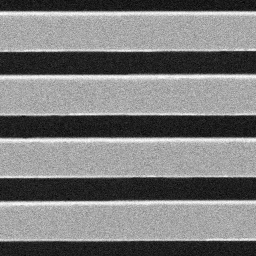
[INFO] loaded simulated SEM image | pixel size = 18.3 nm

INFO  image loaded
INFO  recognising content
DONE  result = lines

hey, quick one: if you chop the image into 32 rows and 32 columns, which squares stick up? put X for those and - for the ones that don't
--------------------------------
XXXXXXXXXXXXXXXXXXXXXXXXXXXXXXXX
XXXXXXXXXXXXXXXXXXXXXXXXXXXXXXXX
XXXXXXXXXXXXXXXXXXXXXXXXXXXXXXXX
XXXXXXXXXXXXXXXXXXXXXXXXXXXXXXXX
XXXXXXXXXXXXXXXXXXXXXXXXXXXXXXXX
--------------------------------
--------------------------------
--------------------------------
XXXXXXXXXXXXXXXXXXXXXXXXXXXXXXXX
XXXXXXXXXXXXXXXXXXXXXXXXXXXXXXXX
XXXXXXXXXXXXXXXXXXXXXXXXXXXXXXXX
XXXXXXXXXXXXXXXXXXXXXXXXXXXXXXXX
XXXXXXXXXXXXXXXXXXXXXXXXXXXXXXXX
--------------------------------
--------------------------------
--------------------------------
XXXXXXXXXXXXXXXXXXXXXXXXXXXXXXXX
XXXXXXXXXXXXXXXXXXXXXXXXXXXXXXXX
XXXXXXXXXXXXXXXXXXXXXXXXXXXXXXXX
XXXXXXXXXXXXXXXXXXXXXXXXXXXXXXXX
XXXXXXXXXXXXXXXXXXXXXXXXXXXXXXXX
--------------------------------
--------------------------------
--------------------------------
XXXXXXXXXXXXXXXXXXXXXXXXXXXXXXXX
XXXXXXXXXXXXXXXXXXXXXXXXXXXXXXXX
XXXXXXXXXXXXXXXXXXXXXXXXXXXXXXXX
XXXXXXXXXXXXXXXXXXXXXXXXXXXXXXXX
XXXXXXXXXXXXXXXXXXXXXXXXXXXXXXXX
--------------------------------
--------------------------------